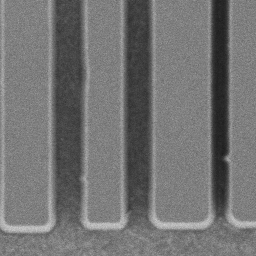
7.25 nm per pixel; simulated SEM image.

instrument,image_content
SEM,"one or a few lines or trenches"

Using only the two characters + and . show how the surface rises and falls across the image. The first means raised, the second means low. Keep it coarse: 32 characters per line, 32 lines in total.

+++++++....+++++...++++++++..+++
+++++++...++++++...++++++++..+++
+++++++....+++++...++++++++..+++
+++++++...++++++...++++++++..+++
+++++++...++++++...++++++++..+++
+++++++...++++++...++++++++.++++
+++++++....+++++...++++++++..+++
+++++++....+++++...++++++++..+++
+++++++....+++++...++++++++..+++
+++++++....+++++...++++++++..+++
+++++++....+++++...++++++++..+++
+++++++....+++++...++++++++..+++
+++++++....+++++...++++++++..+++
+++++++....+++++...++++++++..+++
+++++++....+++++...++++++++..+++
+++++++....+++++...++++++++..+++
+++++++....+++++...++++++++..+++
+++++++....+++++...++++++++..+++
+++++++....+++++...++++++++..+++
+++++++...++++++...++++++++.++++
+++++++...++++++...++++++++.++++
+++++++...++++++...++++++++..+++
+++++++...++++++...++++++++..+++
+++++++....+++++...++++++++..+++
+++++++...++++++...++++++++..+++
+++++++....+++++...++++++++..+++
+++++++....+++++...++++++++..+++
+++++++....+++++...+++++++...+++
.+++++..........................
................................
................................
................................